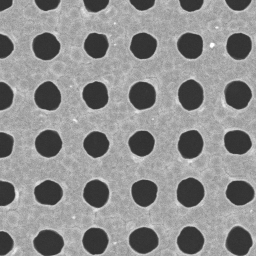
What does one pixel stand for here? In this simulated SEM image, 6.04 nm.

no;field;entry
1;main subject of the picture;a regular array of holes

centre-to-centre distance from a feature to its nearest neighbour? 0.285 micrometres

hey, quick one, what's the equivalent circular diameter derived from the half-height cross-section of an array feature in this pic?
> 161 nanometers